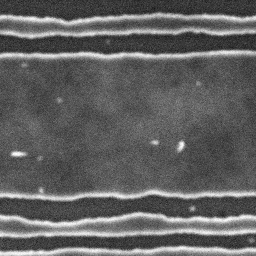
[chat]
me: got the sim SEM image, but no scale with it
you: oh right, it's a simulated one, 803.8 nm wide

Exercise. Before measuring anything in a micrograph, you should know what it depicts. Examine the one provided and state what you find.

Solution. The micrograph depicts lines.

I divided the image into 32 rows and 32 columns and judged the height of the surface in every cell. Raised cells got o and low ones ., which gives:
................................
................................
ooooooo...oooooooooooooooooooooo
oooooooooooooooooooooooooooooooo
..oooo..........................
................................
...........................ooooo
oooooooooooooooooooooooooooooooo
oooooooooooooooooooooooooooooooo
oooooooooooooooooooooooooooooooo
oooooooooooooooooooooooooooooooo
oooooooooooooooooooooooooooooooo
oooooooooooooooooooooooooooooooo
oooooooooooooooooooooooooooooooo
oooooooooooooooooooooooooooooooo
oooooooooooooooooooooooooooooooo
oooooooooooooooooooooooooooooooo
oooooooooooooooooooooooooooooooo
oooooooooooooooooooooooooooooooo
oooooooooooooooooooooooooooooooo
oooooooooooooooooooooooooooooooo
oooooooooooooooooooooooooooooooo
oooooooooooooooooooooooooooooooo
oooooooooooooooooooooooooooooooo
ooooooooooo...oooo....ooo.......
................................
................................
ooo........ooooooooooooooooooooo
oooooooooooooooooooooooooooooooo
.ooo............................
................................
.....ooooooooooooooooooooooooooo